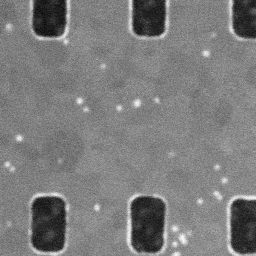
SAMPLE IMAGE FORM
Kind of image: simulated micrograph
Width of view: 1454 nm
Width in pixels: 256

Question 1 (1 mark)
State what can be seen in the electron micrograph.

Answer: holes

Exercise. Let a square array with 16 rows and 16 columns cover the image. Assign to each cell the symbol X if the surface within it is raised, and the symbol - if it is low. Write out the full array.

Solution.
XX--XXXX--XXXX--
XX--XXXX--XXXX--
XXXXXXXXXXXXXXXX
XXXXXXXXXXXXXXXX
XXXXXXXXXXXXXXXX
XXXXXXXXXXXXXXXX
XXXXXXXXXXXXXXXX
XXXXXXXXXXXXXXXX
XXXXXXXXXXXXXXXX
XXXXXXXXXXXXXXXX
XXXXXXXXXXXXXXXX
XXXXXXXXXXXXXXXX
XX--XXXX--XXXXX-
XX--XXXX--XXXX--
XX--XXXX--XXXX--
XX--XXXX--XXXX--